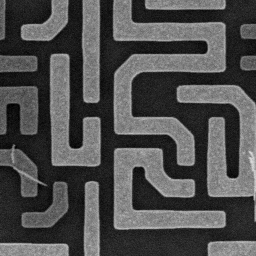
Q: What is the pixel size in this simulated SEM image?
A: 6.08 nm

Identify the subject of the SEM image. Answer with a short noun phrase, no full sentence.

wiring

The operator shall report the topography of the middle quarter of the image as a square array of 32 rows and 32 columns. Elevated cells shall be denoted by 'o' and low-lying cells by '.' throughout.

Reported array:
o....oooo.....oooooooooooooooooo
o....oooo....ooooooooooooooooooo
o....oooo....ooooo..............
o....oooo....oooo...............
o....oooo....oooo...............
o....oooo....oooo............ooo
o....oooo....oooo...........oooo
o....oooo....oooo...........oooo
o....oooo....oooo...........oooo
o....oooo....oooo............ooo
o............oooo...............
o............oooo...............
o............oooo...............
o....oooo....ooooooooooooooo....
o....oooo....oooooooooooooooo...
o....oooo....ooooooooooooooooo..
o....oooo....oooooooooooooooooo.
o....oooo....ooooooooooooooooooo
o....oooo..................ooooo
o....oooo...................oooo
o....oooo...................oooo
ooooooooo....ooooooooooo....oooo
ooooooooo....oooooooooooo...oooo
ooooooooo....oooooooooooo...oooo
ooooooooo....oooooooooooo...oooo
.....ooo.....oooooooooooo.......
.............oooo...ooooo.......
.............oooo...ooooo.......
.............oooo....ooooo......
......oo.....oooo....ooooooooooo
o....oooo....oooo.....oooooooooo
o....oooo....oooo......ooooooooo